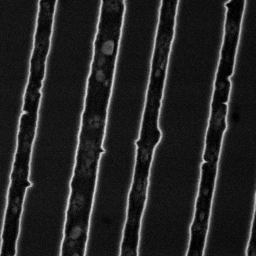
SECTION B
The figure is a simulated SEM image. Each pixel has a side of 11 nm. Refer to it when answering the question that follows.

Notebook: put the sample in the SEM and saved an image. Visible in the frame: one or a few lines or trenches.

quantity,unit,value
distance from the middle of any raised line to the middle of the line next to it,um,0.677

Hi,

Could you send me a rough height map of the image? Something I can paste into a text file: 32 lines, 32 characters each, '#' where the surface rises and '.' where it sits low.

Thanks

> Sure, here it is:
#####..######..#####..######...#
#####..######..#####..######..##
#####..#####...#####..######..##
#####.######...#####..######..##
####..######...####...######..##
####..######...####..#######..##
####..######...####..#######..##
####..######..#####..######..###
####..#####...#####..######..###
####..#####...#####..######..###
###..######...#####..######..###
###..######...####..#######..###
###..######...####..######..####
###..######..#####..######..####
###..#####...#####..######..####
##...#####...#####..######..####
##..######...####...######..####
##..######...####...######..####
##..######...####..#######..####
##..######...####..######..#####
##..#####...#####..######..#####
#...#####...#####..######..#####
#...#####...#####..######..#####
#..######...####..#######..#####
#..######...####..#######..#####
#..######...####..######..######
#..#####...#####..######..######
#..#####...#####..######..######
..######...#####.#######..#####.
..######...####..#######..#####.
..######...####..#######..#####.
..######...####..######..######.